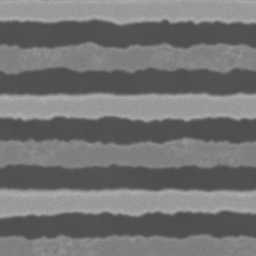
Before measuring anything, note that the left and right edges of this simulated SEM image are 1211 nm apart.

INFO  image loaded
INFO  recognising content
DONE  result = lines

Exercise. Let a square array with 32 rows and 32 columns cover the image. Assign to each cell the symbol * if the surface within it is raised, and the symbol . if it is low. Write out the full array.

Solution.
********************************
********************************
***********..*******.***********
................................
................................
..........**........*....*.*....
********************************
********************************
******..************************
................................
................................
................................
********************************
********************************
*******.*****.******************
................................
................................
......................***.......
********************************
********************************
**.*****************************
................................
................................
................................
********************************
********************************
*******************.**..***..***
................................
................................
.*.....*......**.*.*....**....*.
********************************
********************************